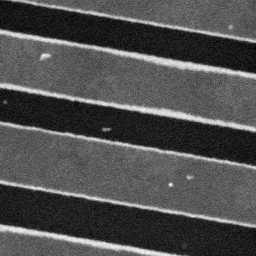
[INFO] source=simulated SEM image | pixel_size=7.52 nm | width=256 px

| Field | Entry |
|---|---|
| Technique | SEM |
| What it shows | lines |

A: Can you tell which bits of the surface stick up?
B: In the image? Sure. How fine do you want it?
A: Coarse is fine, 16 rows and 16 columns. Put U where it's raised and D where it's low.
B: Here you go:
DDDDUUUUUUUUUUUU
DDDDDDDDDUUUUUUU
UUUDDDDDDDDDDDDU
UUUUUUUUUDDDDDDD
UUUUUUUUUUUUUUUD
DUUUUUUUUUUUUUUU
DDDDDDUUUUUUUUUU
DDDDDDDDDDDDUUUU
UUUUUDDDDDDDDDDD
UUUUUUUUUUUDDDDD
UUUUUUUUUUUUUUUU
UUUUUUUUUUUUUUUU
DDDDDDUUUUUUUUUU
DDDDDDDDDDDDUUUU
UUDDDDDDDDDDDDDD
UUUUUUUUDDDDDDDD